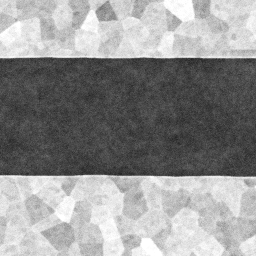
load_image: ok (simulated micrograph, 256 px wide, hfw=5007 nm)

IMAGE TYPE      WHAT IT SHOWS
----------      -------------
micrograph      wiring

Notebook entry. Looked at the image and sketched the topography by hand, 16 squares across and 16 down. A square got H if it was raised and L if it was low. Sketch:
HHHHHHHHHHHHHHHH
HHHHHHHHHHHHHHHH
HHHHHHHHHHHHHHHH
HHHHHHHHHHHHHHHH
LLLLLLLLLLLLLLLL
LLLLLLLLLLLLLLLL
LLLLLLLLLLLLLLLL
LLLLLLLLLLLLLLLL
LLLLLLLLLLLLLLLL
LLLLLLLLLLLLLLLL
LLLLLLLLLLLLLLLL
HHHHHHHHHHHHHHHH
HHHHHHHHHHHHHHHH
HHHHHHHHHHHHHHHH
HHHHHHHHHHHHHHHH
HHHHHHHHHHHHHHHH